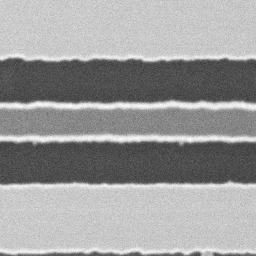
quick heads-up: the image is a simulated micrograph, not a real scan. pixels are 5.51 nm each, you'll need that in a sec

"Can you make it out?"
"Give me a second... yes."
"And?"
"lines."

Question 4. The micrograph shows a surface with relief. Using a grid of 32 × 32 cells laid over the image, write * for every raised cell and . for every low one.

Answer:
********************************
********************************
********************************
********************************
********************************
********************************
********************************
......*...........**............
................................
................................
................................
................................
................................
********************************
********************************
********************************
********************************
************..****.*******.*****
................................
................................
................................
................................
................................
********************************
********************************
********************************
********************************
********************************
********************************
********************************
********************************
*********.*..***..******...*****